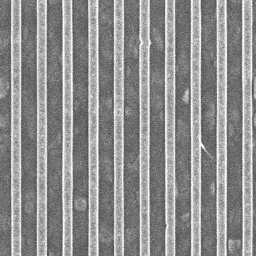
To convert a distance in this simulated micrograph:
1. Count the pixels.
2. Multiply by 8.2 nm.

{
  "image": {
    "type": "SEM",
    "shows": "parallel lines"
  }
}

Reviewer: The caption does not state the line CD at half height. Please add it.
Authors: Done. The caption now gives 74.8 nanometres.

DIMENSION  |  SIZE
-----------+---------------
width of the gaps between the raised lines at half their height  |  134 nm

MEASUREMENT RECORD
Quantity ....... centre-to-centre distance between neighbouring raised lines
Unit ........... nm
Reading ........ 211